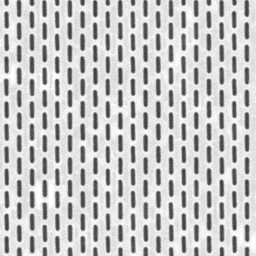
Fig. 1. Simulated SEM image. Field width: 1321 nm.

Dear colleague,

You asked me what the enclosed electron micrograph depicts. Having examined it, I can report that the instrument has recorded a regular array of holes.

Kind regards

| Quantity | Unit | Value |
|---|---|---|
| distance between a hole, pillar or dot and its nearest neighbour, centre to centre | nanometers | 86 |